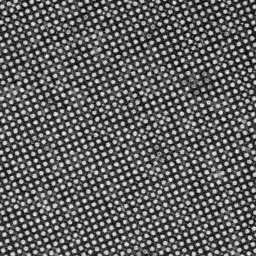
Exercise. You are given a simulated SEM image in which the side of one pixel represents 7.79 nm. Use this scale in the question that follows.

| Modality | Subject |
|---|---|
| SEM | a regular array of raised bodies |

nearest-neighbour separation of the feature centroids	53.9	nm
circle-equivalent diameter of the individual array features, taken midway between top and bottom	0.0305	microns